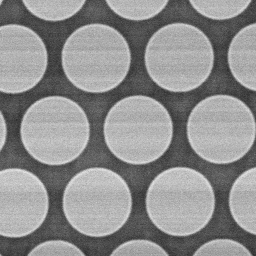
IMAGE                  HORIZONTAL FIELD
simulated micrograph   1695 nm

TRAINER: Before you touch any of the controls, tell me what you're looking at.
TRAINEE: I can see an array of small figures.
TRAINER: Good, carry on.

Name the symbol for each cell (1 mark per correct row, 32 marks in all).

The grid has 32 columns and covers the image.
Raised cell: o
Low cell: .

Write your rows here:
...ooooooo....ooooooo...ooooooo.
....oooooo....oooooo.....ooooo..
......o..........o..............
ooo.......oooo......oooo.......o
ooooo....oooooo....ooooooo...ooo
ooooo...oooooooo..oooooooo...ooo
oooooo..oooooooo..ooooooooo..ooo
oooooo..oooooooo..ooooooooo..ooo
oooooo..oooooooo..oooooooo...ooo
ooooo...oooooooo...ooooooo...ooo
oooo.....oooooo.....ooooo.....oo
.oo.............................
.....oooo......oooo.......oooo..
....oooooo....ooooooo...ooooooo.
...oooooooo..oooooooo...oooooooo
o..oooooooo..oooooooo..ooooooooo
o..oooooooo..oooooooo..ooooooooo
o..oooooooo..oooooooo...oooooooo
...oooooooo...ooooooo...ooooooo.
....oooooo....oooooo.....ooooo..
......oo........................
ooo.......oooo......ooooo......o
ooooo....oooooo....ooooooo....oo
oooooo..oooooooo...ooooooo...ooo
oooooo..oooooooo..ooooooooo..ooo
oooooo..oooooooo..ooooooooo..ooo
oooooo..oooooooo...oooooooo..ooo
ooooo...oooooooo...ooooooo...ooo
ooooo....oooooo.....ooooo.....oo
.oo........oo...................
.....oooo......oooo.......oooo..
....oooooo....ooooooo....oooooo.